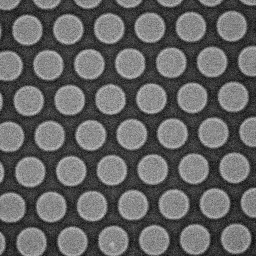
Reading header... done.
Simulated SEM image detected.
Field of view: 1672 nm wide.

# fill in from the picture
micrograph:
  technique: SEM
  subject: an array of small figures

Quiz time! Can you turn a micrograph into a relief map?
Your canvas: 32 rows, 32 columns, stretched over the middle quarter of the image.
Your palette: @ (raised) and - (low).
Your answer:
---@@@@@@@---@@@@@@@---@@@@@@@--
---@@@@@@@---@@@@@@@----@@@@@@--
----@@@@@-----@@@@@------@@@@---
-----@@@--------@---------------
--------------------------------
----------@@@-------@@@@------@@
@@@@-----@@@@@-----@@@@@@----@@@
@@@@@---@@@@@@@---@@@@@@@----@@@
@@@@@---@@@@@@@---@@@@@@@----@@@
@@@@@---@@@@@@@---@@@@@@@----@@@
@@@@@---@@@@@@@----@@@@@@----@@@
@@@@-----@@@@@------@@@@------@@
@@------------------------------
--------------------------------
-----@@@-------@@@@------@@@@---
----@@@@@-----@@@@@@----@@@@@@--
---@@@@@@@---@@@@@@@----@@@@@@@-
---@@@@@@@---@@@@@@@@--@@@@@@@@-
---@@@@@@@---@@@@@@@----@@@@@@@-
---@@@@@@@----@@@@@@----@@@@@@--
----@@@@@------@@@@------@@@@---
--------------------------------
--------------------------------
@@@-------@@@@------@@@@------@@
@@@@@----@@@@@@----@@@@@@----@@@
@@@@@---@@@@@@@----@@@@@@@---@@@
@@@@@---@@@@@@@----@@@@@@@---@@@
@@@@@---@@@@@@@----@@@@@@@---@@@
@@@@@----@@@@@@----@@@@@@-----@@
@@@@------@@@@------@@@@-------@
--------------------------------
--------------------------------